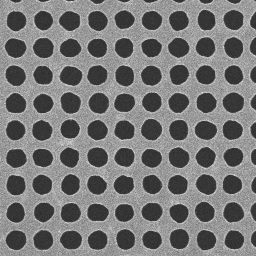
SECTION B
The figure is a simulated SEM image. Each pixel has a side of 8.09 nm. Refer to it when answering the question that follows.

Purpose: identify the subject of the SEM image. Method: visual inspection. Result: a regular array of holes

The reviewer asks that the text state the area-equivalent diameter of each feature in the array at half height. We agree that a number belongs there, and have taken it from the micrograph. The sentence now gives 159 nanometres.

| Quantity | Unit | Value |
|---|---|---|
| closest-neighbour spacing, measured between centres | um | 0.216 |